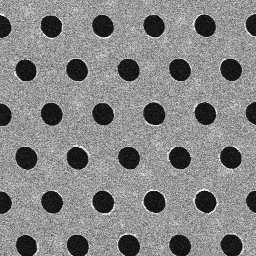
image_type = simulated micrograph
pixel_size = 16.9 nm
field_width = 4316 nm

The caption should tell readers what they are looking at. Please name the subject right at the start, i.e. a regular array of holes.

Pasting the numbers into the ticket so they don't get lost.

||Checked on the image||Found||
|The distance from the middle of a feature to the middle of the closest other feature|854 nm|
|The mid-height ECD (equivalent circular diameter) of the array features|373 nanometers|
